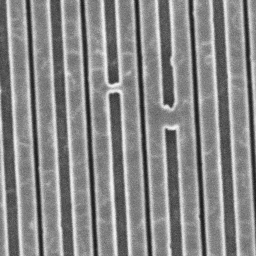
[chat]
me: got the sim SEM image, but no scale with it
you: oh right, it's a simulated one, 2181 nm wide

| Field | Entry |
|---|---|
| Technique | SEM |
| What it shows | parallel lines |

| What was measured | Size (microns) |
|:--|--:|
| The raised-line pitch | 0.231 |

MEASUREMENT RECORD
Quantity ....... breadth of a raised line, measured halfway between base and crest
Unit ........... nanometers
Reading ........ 152